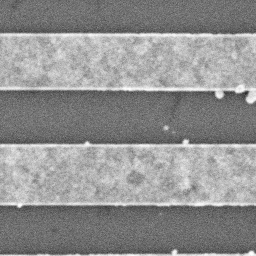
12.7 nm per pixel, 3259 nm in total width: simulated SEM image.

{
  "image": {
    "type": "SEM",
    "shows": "lines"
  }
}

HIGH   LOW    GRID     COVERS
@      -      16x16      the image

----------------
----------------
@@@@@@@@@@@@@@@@
@@@@@@@@@@@@@@@@
@@@@@@@@@@@@@@@@
@@@@@@@@@@@@@@@@
----------------
----------------
----------------
@@@@@@@@@@@@@@@@
@@@@@@@@@@@@@@@@
@@@@@@@@@@@@@@@@
@@@@@@@@@@@@@@@@
----------------
----------------
----------------